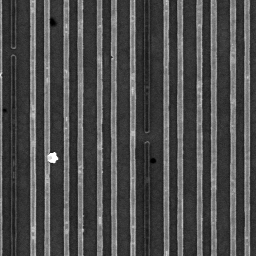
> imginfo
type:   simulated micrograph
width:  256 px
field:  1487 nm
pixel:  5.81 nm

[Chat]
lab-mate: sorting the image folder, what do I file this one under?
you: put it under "parallel lines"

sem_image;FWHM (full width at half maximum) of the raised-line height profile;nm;29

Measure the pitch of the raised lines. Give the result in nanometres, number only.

96.9